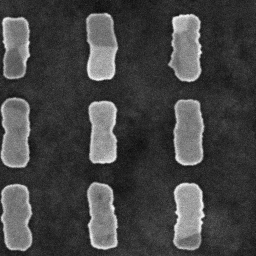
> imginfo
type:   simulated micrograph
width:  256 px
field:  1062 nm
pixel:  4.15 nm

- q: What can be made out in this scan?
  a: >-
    a regular array of raised bodies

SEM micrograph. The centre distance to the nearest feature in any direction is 352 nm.